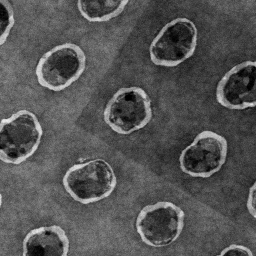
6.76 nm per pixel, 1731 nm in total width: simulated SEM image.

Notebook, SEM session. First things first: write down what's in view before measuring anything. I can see raised bodies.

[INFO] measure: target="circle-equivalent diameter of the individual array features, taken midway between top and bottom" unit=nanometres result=286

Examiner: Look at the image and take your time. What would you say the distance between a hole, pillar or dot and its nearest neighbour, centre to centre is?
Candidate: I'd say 548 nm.